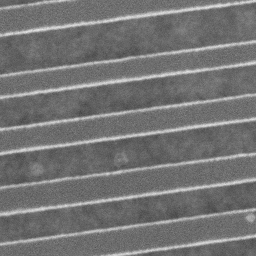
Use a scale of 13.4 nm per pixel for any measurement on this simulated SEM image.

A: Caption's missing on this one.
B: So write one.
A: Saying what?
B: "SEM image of lines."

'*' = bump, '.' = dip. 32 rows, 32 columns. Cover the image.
....**************************..
**********************..........
***************.................
*******.........................
................................
.............................***
......................**********
..............******************
.......*********************....
********************............
************....................
******..........................
...........................*****
...................*************
............********************
.....***********************....
********************............
*************...................
*****...........................
.............................***
......................**********
...............*****************
.......*************************
*************************.......
******************..............
**********......................
***..........................***
......................**********
..............******************
.......*************************
*************************.......
******************..............